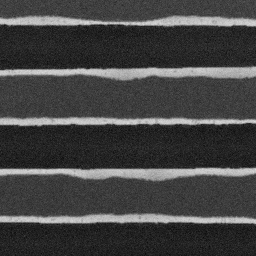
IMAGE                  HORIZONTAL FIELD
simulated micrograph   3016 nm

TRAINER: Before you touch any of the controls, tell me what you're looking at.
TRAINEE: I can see lines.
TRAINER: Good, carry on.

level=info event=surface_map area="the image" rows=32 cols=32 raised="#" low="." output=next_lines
################################
################################
################################
................................
................................
................................
................................
................................
................................
################################
################################
################################
################################
################################
################################
................................
................................
................................
................................
................................
................................
#########...............#####.##
################################
################################
################################
################################
################################
.....#..................###.####
................................
................................
................................
................................